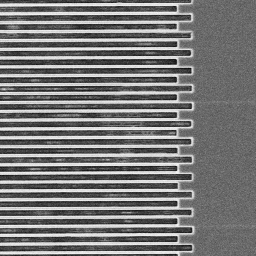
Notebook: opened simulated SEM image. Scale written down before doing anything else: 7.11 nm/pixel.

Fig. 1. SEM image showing parallel lines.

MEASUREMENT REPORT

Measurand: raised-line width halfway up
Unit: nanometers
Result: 21.3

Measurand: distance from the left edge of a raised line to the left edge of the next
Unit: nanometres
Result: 62.9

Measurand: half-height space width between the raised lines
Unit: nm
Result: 42.6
